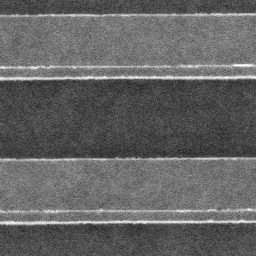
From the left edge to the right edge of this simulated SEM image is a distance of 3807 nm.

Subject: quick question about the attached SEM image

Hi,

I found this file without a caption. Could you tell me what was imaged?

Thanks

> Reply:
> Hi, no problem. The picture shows lines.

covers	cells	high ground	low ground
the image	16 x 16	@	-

----------------
@@@@@@@@@@@@@@@@
@@@@@@@@@@@@@@@@
@@@@@@@@@@@@@@@@
@@@@@@@@@@@@@@@@
----------------
----------------
----------------
----------------
----------------
@@@@@@@@@@@@@@@@
@@@@@@@@@@@@@@@@
@@@@@@@@@@@@@@@@
@@@@@@@@@@@@@@@@
----------------
----------------